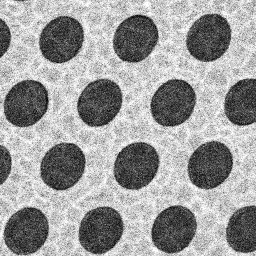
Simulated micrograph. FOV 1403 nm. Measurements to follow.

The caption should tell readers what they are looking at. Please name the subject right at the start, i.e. a regular array of holes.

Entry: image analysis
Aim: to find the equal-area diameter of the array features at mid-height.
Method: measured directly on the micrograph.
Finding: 46.9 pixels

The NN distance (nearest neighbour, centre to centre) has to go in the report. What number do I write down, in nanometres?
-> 399